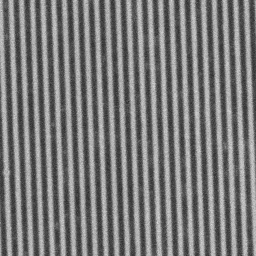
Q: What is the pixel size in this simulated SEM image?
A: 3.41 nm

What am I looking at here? parallel lines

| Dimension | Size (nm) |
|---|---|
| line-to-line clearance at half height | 22.5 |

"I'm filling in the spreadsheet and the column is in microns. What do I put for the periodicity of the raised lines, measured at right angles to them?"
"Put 0.0364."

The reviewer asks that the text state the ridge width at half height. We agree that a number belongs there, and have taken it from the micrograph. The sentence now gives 13.2 nm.